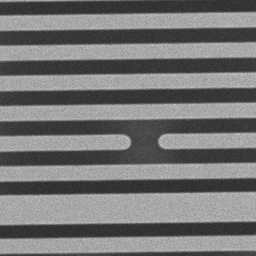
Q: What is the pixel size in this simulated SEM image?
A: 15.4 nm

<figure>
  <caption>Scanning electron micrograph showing groups of lines, slits or small figures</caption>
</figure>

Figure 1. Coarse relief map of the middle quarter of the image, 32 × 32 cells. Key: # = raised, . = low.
................................
................................
...............................#
################################
################################
################################
................................
................................
................................
................................
################################
################################
################################
################################
................................
................................
................................
................................
################........########
#################.......########
################........########
................................
................................
................................
................................
....############################
################################
################################
################################
................................
................................
................................